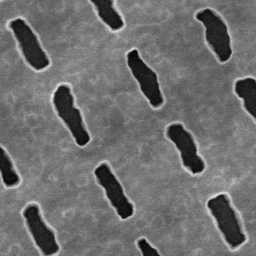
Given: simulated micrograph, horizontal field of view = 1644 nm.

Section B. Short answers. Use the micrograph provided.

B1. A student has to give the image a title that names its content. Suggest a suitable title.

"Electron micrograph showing holes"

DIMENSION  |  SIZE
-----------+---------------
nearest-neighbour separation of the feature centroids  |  516 nanometres